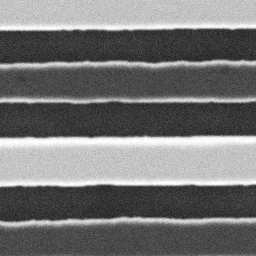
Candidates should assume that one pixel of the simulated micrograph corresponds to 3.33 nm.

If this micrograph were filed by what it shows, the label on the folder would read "lines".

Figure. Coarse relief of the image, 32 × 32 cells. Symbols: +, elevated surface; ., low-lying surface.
++++++++++++++++++++++++++++++++
++++++++++++++++++++++++++++++++
++++++++++++++++++++++++++++++++
++++++++++++++++++++++..+...++..
................................
................................
................................
................................
++++++++++++++++++++++++++++++++
++++++++++++++++++++++++++++++++
++++++++++++++++++++++++++++++++
++++++++++++++++++++++++++++++++
++++++++++++++++++++++++++++++++
................................
................................
................................
................................
++++++++++++++++++++++++++++++++
++++++++++++++++++++++++++++++++
++++++++++++++++++++++++++++++++
++++++++++++++++++++++++++++++++
++++++++++++++++++++++++++++++++
++++++++++++++++++++++++++++++++
................................
................................
................................
................................
........+..++++++++++++.++++++++
++++++++++++++++++++++++++++++++
++++++++++++++++++++++++++++++++
++++++++++++++++++++++++++++++++
++++++++++++++++++++++++++++++++